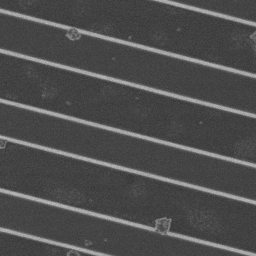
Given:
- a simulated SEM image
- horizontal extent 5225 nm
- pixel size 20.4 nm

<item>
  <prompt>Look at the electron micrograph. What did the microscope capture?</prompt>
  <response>one or a few lines or trenches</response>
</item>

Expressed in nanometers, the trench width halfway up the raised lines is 1020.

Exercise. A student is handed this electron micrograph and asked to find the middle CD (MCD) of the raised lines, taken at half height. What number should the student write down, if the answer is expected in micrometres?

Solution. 0.774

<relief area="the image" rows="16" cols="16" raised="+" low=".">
............++++
+++.............
+++++++.........
.++++++++++.....
.....++++++++++.
.........+++++++
+............+++
+++++...........
+++++++++.......
....+++++++++...
........++++++++
...........+++++
++.............+
++++++..........
.++++++++++.....
.....+++++++++..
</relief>